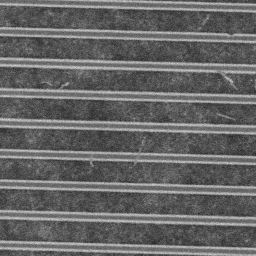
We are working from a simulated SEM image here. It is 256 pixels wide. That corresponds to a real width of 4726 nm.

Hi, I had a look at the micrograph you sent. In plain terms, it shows parallel lines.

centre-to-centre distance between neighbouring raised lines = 0.563 µm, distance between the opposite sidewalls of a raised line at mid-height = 0.125 micrometres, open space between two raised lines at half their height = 0.436 micrometres